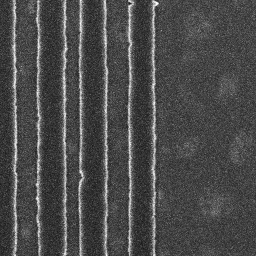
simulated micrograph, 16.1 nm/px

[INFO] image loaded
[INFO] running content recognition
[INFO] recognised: parallel lines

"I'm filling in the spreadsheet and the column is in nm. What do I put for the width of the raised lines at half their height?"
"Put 424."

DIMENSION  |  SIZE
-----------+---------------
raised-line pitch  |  729 nm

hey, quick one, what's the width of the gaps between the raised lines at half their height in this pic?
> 347 nm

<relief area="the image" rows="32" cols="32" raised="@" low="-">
@@---@@@--@@@---@@@@------------
@@---@@@--@@@---@@@-------------
@@---@@@--@@@---@@@-------------
@@---@@@--@@@---@@@-------------
@@---@@@--@@@---@@@-------------
@@---@@@--@@@---@@@-------------
@@---@@@--@@@---@@@-------------
@@---@@@--@@@---@@@-------------
@@---@@@--@@@---@@@-------------
@@---@@@--@@@---@@@-------------
@@---@@@--@@@---@@@-------------
@@---@@@--@@@---@@@-------------
@@---@@@--@@@---@@@-------------
@@---@@@--@@@---@@@-------------
@@---@@@--@@@---@@@-------------
@@---@@@--@@@---@@@-------------
@@---@@@--@@@---@@@-------------
@@---@@@--@@@---@@@-------------
@@---@@@--@@@---@@@-------------
@@---@@@--@@@---@@@-------------
@@---@@@--@@@---@@@-------------
@@---@@@--@@@---@@@-------------
@@---@@@--@@@---@@@-------------
@@---@@@--@@@---@@@-------------
@@---@@@--@@@---@@@-------------
@@---@@@--@@@---@@@-------------
@@---@@@--@@@---@@@-------------
@@---@@@--@@@---@@@-------------
@@---@@@--@@@---@@@-------------
@@---@@@--@@@---@@@-------------
@@---@@@--@@@---@@@-------------
@@---@@@--@@@---@@@-------------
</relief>